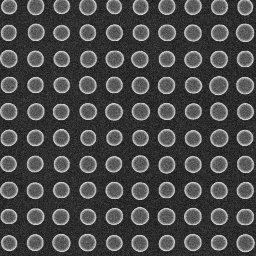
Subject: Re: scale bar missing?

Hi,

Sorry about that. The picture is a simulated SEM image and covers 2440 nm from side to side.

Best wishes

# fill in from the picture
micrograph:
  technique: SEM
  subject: an array of small figures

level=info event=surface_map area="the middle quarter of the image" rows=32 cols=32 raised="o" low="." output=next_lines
o....oo....ooo....oo.....oo....o
................................
................................
.....oo....ooo....oo.....oo.....
o...oooo...ooo...oooo...ooo...oo
o...oooo...oooo..oooo...oooo..oo
o...oooo...ooo...oooo...ooo....o
................................
................................
................................
o...oooo...ooo....ooo...ooo....o
o...oooo...oooo..oooo...oooo..oo
o...oooo...oooo..oooo...oooo..oo
o....oo....ooo....ooo...ooo....o
................................
................................
............o............oo.....
o...oooo...ooo...oooo...ooo....o
o...oooo...oooo..oooo...oooo..oo
o...oooo...ooo...oooo...oooo..oo
..................oo.....oo.....
................................
................................
o....oo....ooo....ooo...ooo....o
o...oooo..oooo...oooo...oooo..oo
o...oooo..oooo...oooo...oooo..oo
o...oooo...ooo....ooo...ooo....o
................................
................................
.....o..........................
o...oooo...ooo...oooo...ooo...oo
o...oooo..ooooo..oooo...oooo..oo